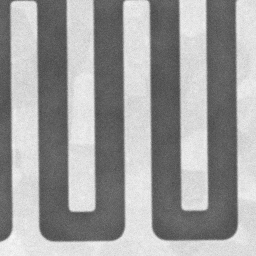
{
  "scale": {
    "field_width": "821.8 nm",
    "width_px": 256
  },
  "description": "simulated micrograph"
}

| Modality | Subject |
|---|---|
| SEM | groups of lines, slits or small figures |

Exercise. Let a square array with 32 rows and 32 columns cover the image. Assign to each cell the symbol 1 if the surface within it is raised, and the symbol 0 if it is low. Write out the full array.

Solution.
00110000111100001110000111000011
01111000111100001110000111000011
01111000111100001110000111000011
01111000111100001110000111000011
01111000111100001110000111000011
01111000111100001110000111000011
01111000111100001110000111000011
01111000011100001110000111000011
01111000011100001110000111000011
01111000011100001110000111000011
01111000011100001110000111000011
01111000011100001110000111000011
01111000011100001110000111000011
01111000011100001110000111000011
00111000011100001110000111000011
00111000011100001110000111000011
00111000011100001110000111000011
00111000011100001110000111000011
00111000011100001110000111000011
00111000011100001110000111000011
00111000011100001110000111000011
00111000011100001110000111000011
00111000011100001110000111000011
00111000011100001110000111000011
00111000011100001110000111000011
00111000011100001110000111000011
00111000000000001110000000000011
00111000000000001110000000000011
00111000000000001110000000000011
01111000000000011110000000000111
11111111111111111111111111111111
11111111111111111111111111111111